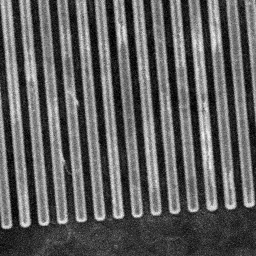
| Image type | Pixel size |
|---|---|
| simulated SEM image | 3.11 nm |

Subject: parallel lines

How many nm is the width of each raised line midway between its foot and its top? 27.5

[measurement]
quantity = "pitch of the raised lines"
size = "58.4 nanometres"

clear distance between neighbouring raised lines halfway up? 32.9 nm